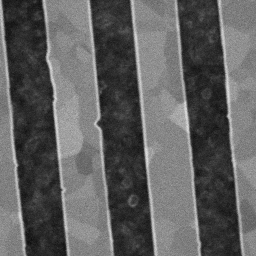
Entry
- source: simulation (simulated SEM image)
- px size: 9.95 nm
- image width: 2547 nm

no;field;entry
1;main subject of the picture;one or a few lines or trenches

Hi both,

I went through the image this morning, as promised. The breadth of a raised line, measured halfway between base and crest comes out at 0.431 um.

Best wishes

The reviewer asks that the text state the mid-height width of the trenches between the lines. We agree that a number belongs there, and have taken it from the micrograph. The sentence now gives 439 nm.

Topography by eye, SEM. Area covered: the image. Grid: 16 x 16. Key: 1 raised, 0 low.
0001110011100011
0001110011100011
0001110001100011
0001110001100011
0001110001100011
0001110001100011
1001110001110011
1001110001110011
1000110001110011
1000110001110001
1000110001110001
1000111001110001
1000111001110001
1000111000110001
1000111000110001
1100111000110001